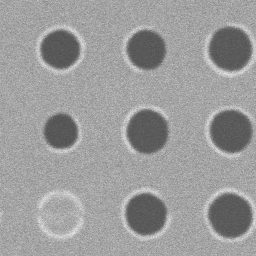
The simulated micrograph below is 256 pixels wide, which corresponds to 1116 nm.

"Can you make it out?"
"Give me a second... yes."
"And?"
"a regular array of holes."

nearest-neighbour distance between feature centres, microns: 0.358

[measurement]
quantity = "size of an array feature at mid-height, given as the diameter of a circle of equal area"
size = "187 nm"